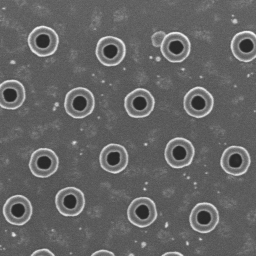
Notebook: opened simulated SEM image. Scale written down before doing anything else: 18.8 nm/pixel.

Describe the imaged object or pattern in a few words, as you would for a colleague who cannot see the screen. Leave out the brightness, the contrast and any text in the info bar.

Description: a regular array of ring-shaped raised bodies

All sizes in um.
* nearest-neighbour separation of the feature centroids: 1.12